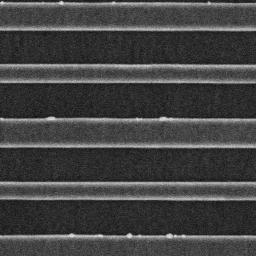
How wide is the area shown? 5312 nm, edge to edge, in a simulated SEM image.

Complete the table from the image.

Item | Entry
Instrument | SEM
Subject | lines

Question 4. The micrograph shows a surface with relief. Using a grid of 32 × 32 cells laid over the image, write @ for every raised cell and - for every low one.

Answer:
@@@@@@@@@@@@@@@@@@@@@@@@@@@@@@@@
@@@@@@@@@@@@@@@@@@@@@@@@@@@@@@@@
@@@@@@@@@@@@@@@@@@@@@@@@@@@@@@@@
@@@@@@@@@@@@@@@@@@@@@@@@@@@@@@@@
--------------------------------
--------------------------------
--------------------------------
--------------------------------
@@@@@@@@@@@@@@@@@@@@@@@@@@@@@@@@
@@@@@@@@@@@@@@@@@@@@@@@@@@@@@@@@
--------------------------------
--------------------------------
--------------------------------
--------------------------------
--------------------------------
@@@@@@@@@@@@@@@@@@@@@@@@@@@@@@@@
@@@@@@@@@@@@@@@@@@@@@@@@@@@@@@@@
@@@@@@@@@@@@@@@@@@@@@@@@@@@@@@@@
--------------------------------
--------------------------------
--------------------------------
--------------------------------
--------------------------------
@@@@@@@@@@@@@@@@@@@@@@@@@@@@@@@@
@@@@@@@@@@@@@@@@@@@@@@@@@@@@@@@@
--------------------------------
--------------------------------
--------------------------------
--------------------------------
--------@@-@@--@@@--@@@@--------
@@@@@@@@@@@@@@@@@@@@@@@@@@@@@@@@
@@@@@@@@@@@@@@@@@@@@@@@@@@@@@@@@